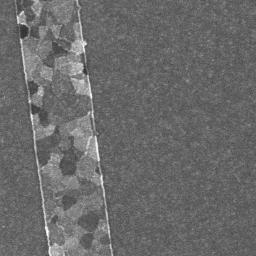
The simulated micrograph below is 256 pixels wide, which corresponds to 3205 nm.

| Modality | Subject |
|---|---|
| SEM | one or a few lines or trenches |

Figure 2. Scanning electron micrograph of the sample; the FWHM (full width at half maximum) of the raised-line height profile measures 768 nm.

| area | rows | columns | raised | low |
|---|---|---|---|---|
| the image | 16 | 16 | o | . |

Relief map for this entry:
.oooo...........
.oooo...........
.oooo...........
.oooo...........
..ooo...........
..oooo..........
..oooo..........
..oooo..........
..oooo..........
..oooo..........
..oooo..........
...ooo..........
...oooo.........
...oooo.........
...oooo.........
...oooo.........